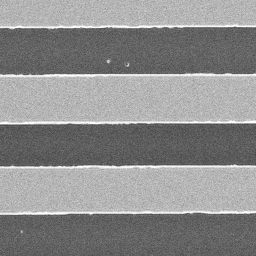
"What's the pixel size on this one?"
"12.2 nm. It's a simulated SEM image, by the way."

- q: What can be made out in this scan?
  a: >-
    lines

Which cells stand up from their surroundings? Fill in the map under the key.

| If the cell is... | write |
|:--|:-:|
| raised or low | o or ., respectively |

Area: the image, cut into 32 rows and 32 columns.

oooooooooooooooooooooooooooooooo
oooooooooooooooooooooooooooooooo
oooooooooooooooooooooooooooooooo
................................
................................
................................
................................
................................
................................
oooooooooooooooooooooooooooooooo
oooooooooooooooooooooooooooooooo
oooooooooooooooooooooooooooooooo
oooooooooooooooooooooooooooooooo
oooooooooooooooooooooooooooooooo
oooooooooooooooooooooooooooooooo
................................
................................
................................
................................
................................
................................
oooooooooooooooooooooooooooooooo
oooooooooooooooooooooooooooooooo
oooooooooooooooooooooooooooooooo
oooooooooooooooooooooooooooooooo
oooooooooooooooooooooooooooooooo
oooooooooooooooooooooooo..oo.oo.
................................
................................
................................
................................
................................